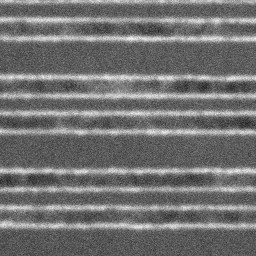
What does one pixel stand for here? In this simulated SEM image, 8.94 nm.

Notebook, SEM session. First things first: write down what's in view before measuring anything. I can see lines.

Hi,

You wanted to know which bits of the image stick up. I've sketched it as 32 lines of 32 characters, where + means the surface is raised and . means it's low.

++++++++++++++++++++++++++++++++
++++++++++++++++++++++++++++++++
++++++++++++++++++++++++++++++++
................................
................................
++++++++++++++++++++++++++++++++
++++++++++++++++++++++++++++++++
++++++++++++++++++++++++++++++++
++++++++++++++++++++++++++++++++
++++++++++++++++++++++++++++++++
................................
................................
++++++++++++++++++++++++++++++++
++++++++++++++++++++++++++++++++
................................
................................
++++++++++++++++++++++++.+++++++
++++++++++++++++++++++++++++++++
++++++++++++++++++++++++++++++++
++++++++++++++++++++++++++++++++
++++++++++++++++++++++++++++++++
...+...+.+.......+..+...........
................................
................................
++++++++++++++++++++++++++++++++
++++++++++++++++++++++++++++++++
................................
................................
++++++++++++++++++++++++++++++++
++++++++++++++++++++++++++++++++
++++++++++++++++++++++++++++++++
++++++++++++++++++++++++++++++++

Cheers